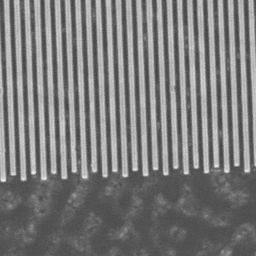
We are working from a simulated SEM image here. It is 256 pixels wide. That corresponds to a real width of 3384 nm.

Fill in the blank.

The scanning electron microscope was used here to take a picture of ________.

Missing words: parallel lines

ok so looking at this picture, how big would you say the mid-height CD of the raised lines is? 49.5 nm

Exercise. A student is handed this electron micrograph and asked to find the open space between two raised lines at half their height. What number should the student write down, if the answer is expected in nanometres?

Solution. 85.9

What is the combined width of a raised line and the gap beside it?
10.1 pixels